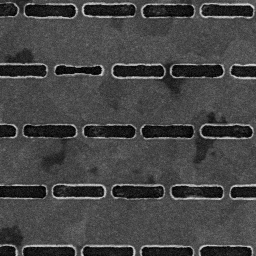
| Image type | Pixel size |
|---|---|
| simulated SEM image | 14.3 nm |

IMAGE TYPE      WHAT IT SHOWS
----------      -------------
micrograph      a regular array of holes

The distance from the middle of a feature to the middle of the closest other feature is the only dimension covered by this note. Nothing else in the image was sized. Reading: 833 nm